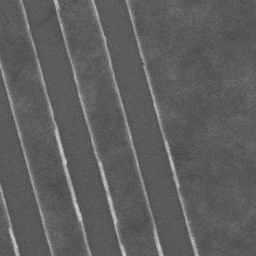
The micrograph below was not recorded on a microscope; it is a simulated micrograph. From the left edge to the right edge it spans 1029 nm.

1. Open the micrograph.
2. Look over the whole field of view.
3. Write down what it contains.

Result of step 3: one or a few lines or trenches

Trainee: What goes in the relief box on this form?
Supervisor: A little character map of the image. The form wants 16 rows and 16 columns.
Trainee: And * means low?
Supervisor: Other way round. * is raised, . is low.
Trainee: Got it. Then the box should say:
*...**..********
**..**..********
**..***..*******
**..***..*******
***..**..*******
***..**..*******
.**..***..******
.**..***..******
.***..**..******
.***..**..******
..**..***..*****
..**...**..*****
..***..**..*****
*..**..***..****
*..**..***..****
*..***..**..****